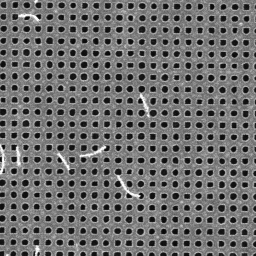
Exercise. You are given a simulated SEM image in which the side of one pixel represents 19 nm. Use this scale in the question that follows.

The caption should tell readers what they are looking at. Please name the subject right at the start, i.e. a regular array of holes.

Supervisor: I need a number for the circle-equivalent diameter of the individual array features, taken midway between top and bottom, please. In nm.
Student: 125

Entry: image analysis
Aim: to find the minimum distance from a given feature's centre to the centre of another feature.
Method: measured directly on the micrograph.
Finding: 0.217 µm